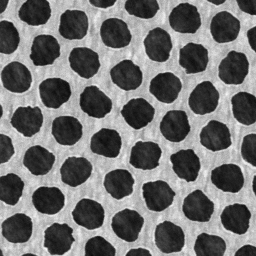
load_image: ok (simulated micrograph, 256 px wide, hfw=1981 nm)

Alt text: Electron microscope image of a regular array of holes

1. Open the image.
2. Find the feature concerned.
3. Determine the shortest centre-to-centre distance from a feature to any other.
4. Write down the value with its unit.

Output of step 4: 303 nm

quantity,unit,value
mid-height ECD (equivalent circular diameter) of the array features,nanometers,245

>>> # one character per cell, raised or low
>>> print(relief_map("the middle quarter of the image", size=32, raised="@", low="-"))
@@-------@@@@------@@@@@@@@@@---
@@-------@@@-------@@@@@@@@@@@--
@@@-----@@@---------@@@@---@@@@-
@@@@@-@@@@@@--------@@-------@@@
-@@@@@@@@@@@--------@@-------@@@
-@@@@@--@@@@@------@@---------@@
--@@@----@@@@@@---@@@--------@@@
--@@------@@@@@@@@@@@@-------@@-
-@@@-------@@@@@@@--@@@-----@@@-
-@@@--------@@@@-----@@@---@@@@-
@@@@--------@@@-------@@@@@@@@@-
@@@@--------@@---------@@@@@@@@@
@@@@@@-----@@@---------@@------@
---@@@@@-@@@@@@-------@@@------@
----@@@@@@@@@@@@------@@-------@
-----@@@@@@@@@@@@----@@@--------
-----@@@@----@@@@@@@@@@@--------
-----@@@------@@@@@@@@@@-------@
----@@@-------@@@@@@@@@@@-----@@
---@@@@--------@@@----@@@@@--@@@
@-@@@@@-------@@@-------@@@@@@@@
@@@@@@@-------@@@-------@@@@@---
@@@@@@@@------@@@-------@@@-----
@----@@@@@@-@@@@--------@@@-----
-------@@@@@@@@@--------@@@-----
-------@@@@@@@@@@-------@@@-----
-------@@@@@@---@@@@--@@@@@-----
-------@@@@------@@@@@@@@@@@----
------@@@@-------@@@@@@@@@@@@---
-----@@@@@--------@@@-----@@@@@@
@--@@@@@@@--------@@-------@@@@@
@@@@@@@@@@-------@@@-------@@@@@